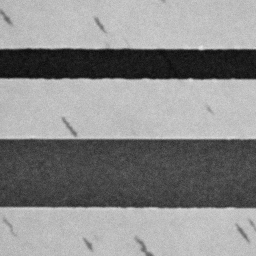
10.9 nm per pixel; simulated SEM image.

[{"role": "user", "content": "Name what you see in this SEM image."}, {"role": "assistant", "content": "lines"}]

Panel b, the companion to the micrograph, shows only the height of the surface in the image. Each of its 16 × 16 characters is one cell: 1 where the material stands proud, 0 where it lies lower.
1111111111111111
1111111111111111
1111111111111111
0000000000000000
0000000000000000
1111111111111111
1111111111111111
1111111111111111
1111111111111111
0000000000000000
0000000000000000
0000000000000000
0000000000000000
1111111111111111
1111111111111111
1111111111111111